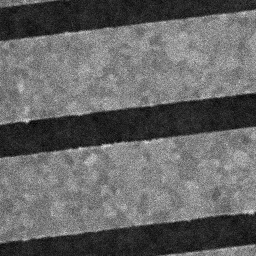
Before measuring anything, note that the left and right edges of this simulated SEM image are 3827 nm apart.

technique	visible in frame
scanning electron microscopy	one or a few lines or trenches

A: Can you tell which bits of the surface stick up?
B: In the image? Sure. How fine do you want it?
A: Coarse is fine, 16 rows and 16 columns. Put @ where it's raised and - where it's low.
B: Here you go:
----------------
---------@@@@@@@
-@@@@@@@@@@@@@@@
@@@@@@@@@@@@@@@@
@@@@@@@@@@@@@@@@
@@@@@@@@@@@@@@@@
@@@@@@@@@@------
@@--------------
-----------@@@@@
---@@@@@@@@@@@@@
@@@@@@@@@@@@@@@@
@@@@@@@@@@@@@@@@
@@@@@@@@@@@@@@@@
@@@@@@@@@@@@@---
@@@@@-----------
--------------@@